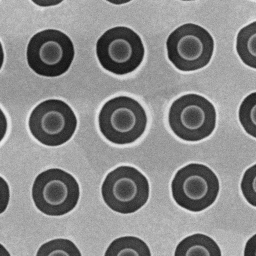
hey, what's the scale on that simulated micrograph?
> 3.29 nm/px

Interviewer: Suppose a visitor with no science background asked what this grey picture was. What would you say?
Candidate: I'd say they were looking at an array of small figures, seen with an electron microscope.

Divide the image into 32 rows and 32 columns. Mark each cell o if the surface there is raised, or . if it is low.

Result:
oooo...ooooooo.ooooooooooooooooo
oooooooooooooooooooooooooooooooo
oooooooooooooooooooooooooooooooo
oooooooooooooo..oooooo...ooooo..
oooo....ooooo....oooo.....oooo..
oooo.....ooo......ooo......oo...
ooo......ooo......ooo......ooo..
.oo......ooo......ooo.....oooo..
oooo.....oooo....ooooo...oooooo.
ooooo..oooooooo.oooooooooooooooo
oooooooooooooooooooooooooooooooo
oooooooooooooooooooooooooooooooo
oooooo..ooooo....ooooo....oooo..
oooo.....oooo.....ooo......ooo..
.ooo......oo.......oo......ooo..
.oo.......oo.......oo......ooo..
.ooo.....ooo......ooo......oooo.
ooooo....oooo....oooooo..ooooooo
oooooooooooooooooooooooooooooooo
oooooooooooooooooooooooooooooooo
ooooooooooooooooooooooo..ooooooo
ooooo...oooooo....oooo.....oooo.
.ooo......ooo.....oooo.....ooo..
.ooo......ooo......oo......ooo..
.ooo......ooo......ooo.....ooo..
.ooo......ooo.....oooo.....oooo.
ooooo....oooooo..ooooooo.ooooooo
oooooooooooooooooooooooooooooooo
oooooooooooooooooooooooooooooooo
ooooooooooooooooooooooo...oooooo
ooooo....ooooo....oooo.....oooo.
.oooo.....ooo......ooo......ooo.